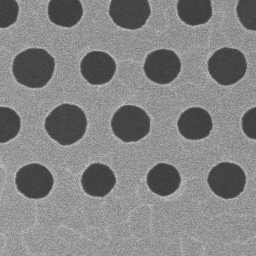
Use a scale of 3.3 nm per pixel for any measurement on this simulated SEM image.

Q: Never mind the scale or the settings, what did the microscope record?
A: a regular array of holes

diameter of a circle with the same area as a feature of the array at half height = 119 nm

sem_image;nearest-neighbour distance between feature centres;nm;212